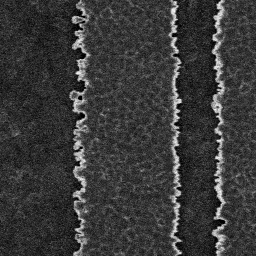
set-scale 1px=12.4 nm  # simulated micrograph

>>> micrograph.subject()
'one or a few lines or trenches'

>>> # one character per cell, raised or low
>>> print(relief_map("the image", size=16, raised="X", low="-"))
-----XXXXXX---XX
-----XXXXXX---XX
-----XXXXXX---XX
-----XXXXXX--XXX
-----XXXXXX---XX
-----XXXXXX---XX
-----XXXXXX---XX
-----XXXXXX---XX
-----XXXXXX---XX
-----XXXXXX---XX
-----XXXXXX---XX
-----XXXXXX---XX
-----XXXXXX---XX
-----XXXXXX---XX
-----XXXXXX---XX
-----XXXXXX---XX